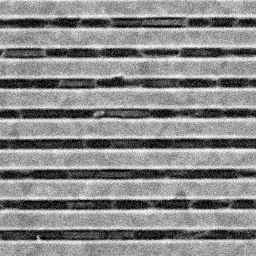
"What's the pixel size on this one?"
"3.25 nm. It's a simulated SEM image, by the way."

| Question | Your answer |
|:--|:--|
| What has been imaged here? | parallel lines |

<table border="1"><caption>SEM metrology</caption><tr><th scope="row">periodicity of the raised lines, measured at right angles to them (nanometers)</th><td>98.4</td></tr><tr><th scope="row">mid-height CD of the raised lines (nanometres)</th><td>60.1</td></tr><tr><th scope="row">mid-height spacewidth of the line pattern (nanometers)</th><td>38.5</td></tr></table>